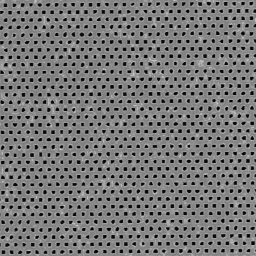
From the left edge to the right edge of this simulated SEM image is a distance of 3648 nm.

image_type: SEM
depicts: a regular array of holes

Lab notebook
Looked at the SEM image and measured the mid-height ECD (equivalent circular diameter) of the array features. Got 55.7 nanometers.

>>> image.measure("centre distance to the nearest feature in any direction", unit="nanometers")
116